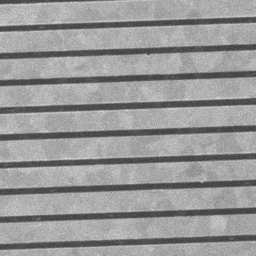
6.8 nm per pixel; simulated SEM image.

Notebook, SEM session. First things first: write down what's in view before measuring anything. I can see parallel lines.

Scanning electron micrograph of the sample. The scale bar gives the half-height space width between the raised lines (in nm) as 46.7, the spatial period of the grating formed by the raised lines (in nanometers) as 185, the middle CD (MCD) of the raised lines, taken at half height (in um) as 0.136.